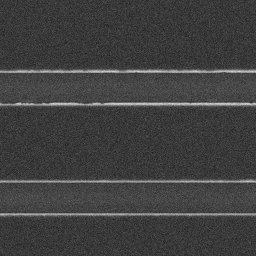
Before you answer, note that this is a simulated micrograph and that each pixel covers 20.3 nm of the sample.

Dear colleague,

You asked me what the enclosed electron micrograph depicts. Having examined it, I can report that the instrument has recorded lines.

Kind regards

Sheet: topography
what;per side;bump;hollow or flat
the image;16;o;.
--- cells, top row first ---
oooooooooooooooo
oooooooooooooooo
oooooooooooooooo
oooooooooooooooo
................
................
...ooooooooooooo
oooooooooooooooo
oooooooooooooooo
oooooooooooooooo
oooooooooooooooo
................
................
oooooooooooooooo
oooooooooooooooo
oooooooooooooooo